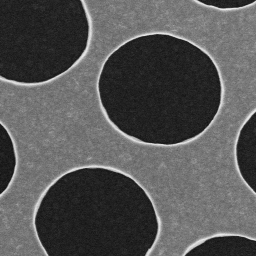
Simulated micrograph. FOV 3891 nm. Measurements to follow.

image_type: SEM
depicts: holes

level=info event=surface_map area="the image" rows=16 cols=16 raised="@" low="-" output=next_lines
-----@@@@@@@@@@@
------@@@@@@@@@@
-----@@@---@@@@@
-----@@------@@@
----@@--------@@
@@@@@@--------@@
@@@@@@--------@@
@@@@@@@------@@@
-@@@@@@@----@@@-
-@@@@@@@@@@@@@@-
-@@@@-@@@@@@@@@-
-@@------@@@@@@-
@@@------@@@@@@@
@@--------@@@@@@
@@--------@@@@@@
@@@------@@@----